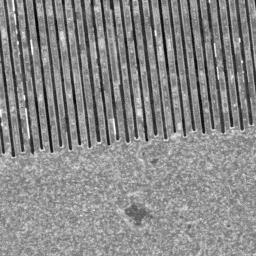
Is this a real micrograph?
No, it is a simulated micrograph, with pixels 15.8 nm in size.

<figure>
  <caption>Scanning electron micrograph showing parallel lines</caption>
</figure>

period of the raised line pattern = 9.58 px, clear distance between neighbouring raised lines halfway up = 60.9 nanometres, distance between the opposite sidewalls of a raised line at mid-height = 94.5 nm